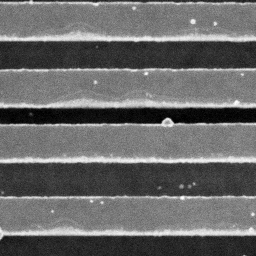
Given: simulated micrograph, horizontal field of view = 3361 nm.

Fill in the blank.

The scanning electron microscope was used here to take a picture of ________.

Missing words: lines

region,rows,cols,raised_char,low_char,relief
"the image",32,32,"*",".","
********************************
********************************
********************************
********************************
********************************
................................
................................
................................
................................
********************************
********************************
********************************
********************************
................................
................................
.............*.**...***.**.*****
********************************
********************************
********************************
********************************
................................
................................
................................
................................
................................
********************************
********************************
********************************
********************************
*...............................
................................
................................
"